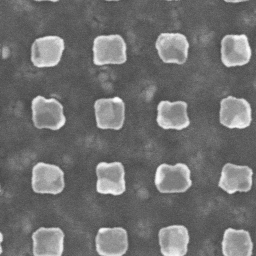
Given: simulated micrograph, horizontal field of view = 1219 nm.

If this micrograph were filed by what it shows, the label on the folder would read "a regular array of raised bodies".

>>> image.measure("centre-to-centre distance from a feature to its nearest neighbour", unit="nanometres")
297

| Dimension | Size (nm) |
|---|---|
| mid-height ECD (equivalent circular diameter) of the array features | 151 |